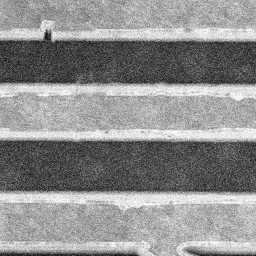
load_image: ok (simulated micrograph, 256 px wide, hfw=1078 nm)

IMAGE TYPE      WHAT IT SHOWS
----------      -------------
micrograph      one or a few lines or trenches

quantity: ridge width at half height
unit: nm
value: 193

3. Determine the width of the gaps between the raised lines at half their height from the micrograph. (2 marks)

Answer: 245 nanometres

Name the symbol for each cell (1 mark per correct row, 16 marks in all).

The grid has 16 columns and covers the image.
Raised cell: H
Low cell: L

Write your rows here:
HHHHHHHHHHHHHHHH
HHHHHHHHHHHHHHHH
LLLLLLLLLLLLLLLL
LLLLLLLLLLLLLLLL
LLLLLLLLLLLLLLLL
LLLLLLLLLLLLLLLL
HHHHHHHHHHHHHHHH
HHHHHHHHHHHHHHHH
LLLLLLLLLLHLLLLL
LLLLLLLLLLLLLLLL
LLLLLLLLLLLLLLLL
LLLLLLLLLLLLLLLL
HHHHHHHHHHHHHHHH
HHHHHHHHHHHHHHHH
HHHHHHHHHHHHHHHH
LLLLLLLLHHHHHLLL